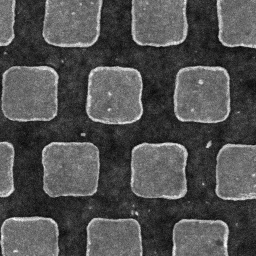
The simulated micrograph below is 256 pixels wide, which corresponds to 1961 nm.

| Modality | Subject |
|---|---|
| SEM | raised bodies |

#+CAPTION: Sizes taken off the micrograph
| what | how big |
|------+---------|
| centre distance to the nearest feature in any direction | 654 nm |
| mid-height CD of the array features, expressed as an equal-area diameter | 0.458 um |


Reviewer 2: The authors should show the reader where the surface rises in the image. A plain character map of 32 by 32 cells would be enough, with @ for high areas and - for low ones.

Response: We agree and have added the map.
@@----@@@@@@@----@@@@@@----@@@@@
@@----@@@@@@-----@@@@@@----@@@@@
@@----@@@@@@-----@@@@@@-----@@@@
@@---@@@@@@@-----@@@@@@-----@@@@
@@---@@@@@@@-----@@@@@@-----@@@@
@-----@@@@@------@@@@@------@@@@
--------------------------------
--------------------------------
-@@@@@-------@----------@@@-----
@@@@@@@----@@@@@@@----@@@@@@----
@@@@@@@----@@@@@@@----@@@@@@@---
@@@@@@@----@@@@@@@----@@@@@@@---
@@@@@@@----@@@@@@@----@@@@@@@---
@@@@@@@----@@@@@@@----@@@@@@@---
-@@@@@@----@@@@@@@----@@@@@@----
--------------------------------
--------------------------------
--------------------------------
@@----@@@@@@-----@@@@@@-----@@@@
@@---@@@@@@@-----@@@@@@----@@@@@
@@---@@@@@@@----@@@@@@@----@@@@@
@@----@@@@@@-----@@@@@@----@@@@@
@@----@@@@@@----@@@@@@@----@@@@@
@@----@@@@@@----@@@@@@@----@@@@@
@-----@-----------@@@@@----@@@@@
--------------------------------
--------------------------------
-@@@@@@-----@---@---------------
@@@@@@@----@@@@@@@----@@@@@@----
@@@@@@@----@@@@@@@----@@@@@@----
@@@@@@@----@@@@@@@----@@@@@@----
@@@@@@@----@@@@@@@----@@@@@@----